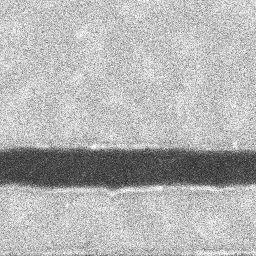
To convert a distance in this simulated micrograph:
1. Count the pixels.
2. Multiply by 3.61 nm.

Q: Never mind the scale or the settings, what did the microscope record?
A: one or a few lines or trenches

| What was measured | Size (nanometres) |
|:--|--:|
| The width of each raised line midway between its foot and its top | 160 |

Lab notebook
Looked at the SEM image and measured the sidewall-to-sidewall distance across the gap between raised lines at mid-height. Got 0.227 µm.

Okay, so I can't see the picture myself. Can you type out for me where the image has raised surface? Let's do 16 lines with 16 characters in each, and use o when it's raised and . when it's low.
................
................
................
................
................
................
................
................
................
oooooooooooooooo
oooooooooooooooo
oooooooooooooooo
................
................
................
................